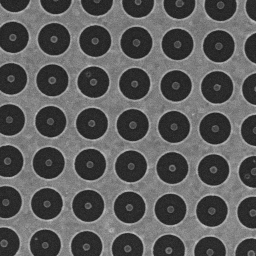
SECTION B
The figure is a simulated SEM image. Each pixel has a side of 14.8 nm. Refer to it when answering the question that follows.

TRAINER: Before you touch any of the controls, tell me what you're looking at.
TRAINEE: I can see an array of small figures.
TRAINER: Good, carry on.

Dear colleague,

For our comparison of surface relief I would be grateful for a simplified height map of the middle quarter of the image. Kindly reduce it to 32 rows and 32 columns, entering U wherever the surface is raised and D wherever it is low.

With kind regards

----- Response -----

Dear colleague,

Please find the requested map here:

UUUUUUDDUUUUUUUUUUUUUUUUUUUUUUUU
UUUUUDDDDDUUUUUDDDDDUUUUUUUDDUUU
DUUUDDDDDDDUUUDDDDDDDUUUUDDDDDDU
DUUDDDDDDDDUUUDDDDDDDUUUDDDDDDDD
DUUDDDDUDDDDUUDDDUDDDDUUDDDDDDDD
DUUDDDDDDDDUUUDDDUDDDDUUDDDUUDDD
DUUUDDDDDDDUUUDDDDDDDUUUDDDDDDDD
UUUUUDDDDDUUUUDDDDDDDUUUUDDDDDDD
UUUUUUDDUUUUUUUUDDDDUUUUUDDDDDDU
UUUUUUUUUUUUUUUUUUUUUUUUUUUDDUUU
UUUUUUUUUUUUUUUUUUUUUUUUUUUUUUUU
UUUUUDDDDUUUUUUDDDDUUUUUUUUUUUUU
UUUUDDDDDDUUUUDDDDDDUUUUUDDDDDUU
DUUDDDDDDDDUUDDDDDDDDUUUDDDDDDDU
DUUDDDUUDDDUUDDDDDDDDUUUDDDDDDDU
DUUDDDDDDDDUUDDDDUDDDUUDDDDUDDDD
UUUDDDDDDDDUUDDDDDDDDUUDDDDDDDDD
UUUUDDDDDDUUUUDDDDDDDUUUDDDDDDDU
UUUUUDDDDUUUUUUDDDDDUUUUUDDDDDDU
UUUUUUUUUUUUUUUUDDUUUUUUUUDDDUUU
UUUUUUUUUUUUUUUUUUUUUUUUUUUUUUUU
UUUUUDDDDUUUUUUUDUUUUUUUUUUUUUUU
UUUDDDDDDDUUUUDDDDDUUUUUUDDDDUUU
UUUDDDDDDDUUUDDDDDDDUUUUDDDDDDUU
UUDDDDDDDDDUUDDDDDDDDUUDDDDDDDDU
UUDDDDUDDDDUDDDDUDDDDUUDDDDDDDDU
UUUDDDDDDDUUUDDDDDDDDUUDDDDDDDDU
UUUDDDDDDDUUUDDDDDDDUUUDDDDDDDDU
UUUUDDDDDUUUUUDDDDDDUUUUDDDDDDUU
UUUUUUUUUUUUUUUDDDUUUUUUUDDDDUUU
UUUUUUUUUUUUUUUUUUUUUUUUUUUUUUUU
UUUUUDDUUUUUUUUUUUUUUUUUUUUUUUUU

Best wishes